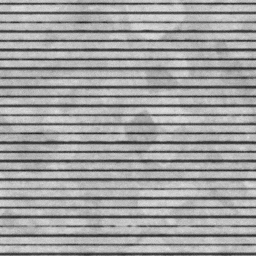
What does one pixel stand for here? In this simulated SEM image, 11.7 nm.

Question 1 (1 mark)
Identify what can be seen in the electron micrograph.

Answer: parallel lines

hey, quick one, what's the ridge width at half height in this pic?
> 72.9 nanometers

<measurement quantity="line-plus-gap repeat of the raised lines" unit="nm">108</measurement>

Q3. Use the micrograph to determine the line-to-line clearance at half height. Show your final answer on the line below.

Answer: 0.0408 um